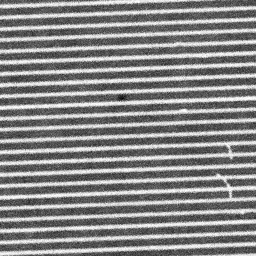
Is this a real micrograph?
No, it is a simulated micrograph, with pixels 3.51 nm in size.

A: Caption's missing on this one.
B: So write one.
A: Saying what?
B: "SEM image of parallel lines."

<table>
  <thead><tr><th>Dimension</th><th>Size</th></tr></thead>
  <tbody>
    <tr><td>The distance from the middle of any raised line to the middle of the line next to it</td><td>11.2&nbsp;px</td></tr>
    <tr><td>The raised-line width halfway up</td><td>9.6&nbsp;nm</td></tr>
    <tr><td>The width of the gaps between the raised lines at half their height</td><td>30.7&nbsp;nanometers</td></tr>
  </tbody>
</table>